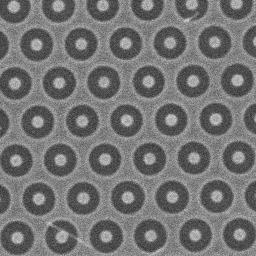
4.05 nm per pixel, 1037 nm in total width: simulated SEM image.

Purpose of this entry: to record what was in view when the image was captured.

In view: an array of small figures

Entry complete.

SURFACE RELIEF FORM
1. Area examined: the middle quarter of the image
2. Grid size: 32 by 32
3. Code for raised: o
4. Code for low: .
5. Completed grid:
ooooooooo..ooooooooo..oooooooo..
..ooooo......ooooo......ooooo...
..oooo........oooo.......ooo....
...ooo........ooo...oo...ooo...o
...ooo...oo...ooo...oo...ooo...o
...ooo...oo...ooo...oo...ooo....
...ooo........oooo.......oooo...
..ooooo......oooooo.....ooooo...
.ooooooo....oooooooo..ooooooooo.
oooooooooooooooooooooooooooooooo
ooo...ooooooo.....oooooo.....ooo
oo......oooo.......oooo.......oo
o.......oooo.......oooo........o
....o....oo....oo...ooo...oo...o
...ooo...oo...ooo...ooo...oo...o
o........ooo........ooo........o
o.......oooo.......oooo.......oo
oo.....oooooo.....ooooooo....ooo
oooo.ooooooooooooooooooooooooooo
ooooooooooooooooooooo.ooooooooo.
.ooooooo.....oooooo.....ooooo...
..ooooo.......oooo.......oooo...
...ooo........ooo........ooo....
...ooo...oo...ooo...oo....oo...o
...ooo...oo...ooo....o....oo....
...ooo........oooo.......oooo...
...oooo.......oooo.......ooooo..
..oooooo.....oooooo.....ooooooo.
oooooooooooooooooooooooooooooooo
oooo..oooooooo....ooooooo....ooo
oo......ooooo......ooooo......oo
o........ooo........ooo........o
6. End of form